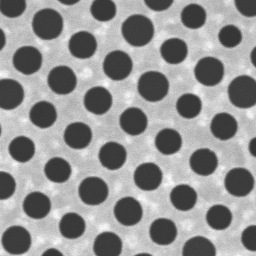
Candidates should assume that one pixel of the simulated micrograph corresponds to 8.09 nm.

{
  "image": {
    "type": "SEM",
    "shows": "a regular array of holes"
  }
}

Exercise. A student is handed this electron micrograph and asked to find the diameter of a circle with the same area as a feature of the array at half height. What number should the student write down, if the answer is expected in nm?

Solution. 231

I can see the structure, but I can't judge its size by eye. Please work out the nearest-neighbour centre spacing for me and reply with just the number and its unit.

325 nm